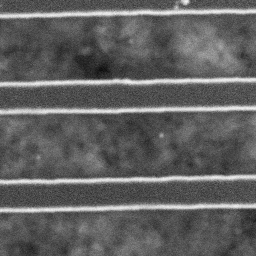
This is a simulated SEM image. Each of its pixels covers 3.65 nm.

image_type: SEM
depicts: lines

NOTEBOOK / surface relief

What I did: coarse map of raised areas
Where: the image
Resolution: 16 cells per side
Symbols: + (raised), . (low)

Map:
++++++++++++++++
................
................
................
................
++++++++++++++++
++++++++++++++++
................
................
................
................
++++++++++++++++
++++++++++++++++
................
................
................